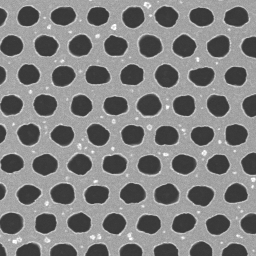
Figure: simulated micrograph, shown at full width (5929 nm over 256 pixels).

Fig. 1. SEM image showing a regular array of holes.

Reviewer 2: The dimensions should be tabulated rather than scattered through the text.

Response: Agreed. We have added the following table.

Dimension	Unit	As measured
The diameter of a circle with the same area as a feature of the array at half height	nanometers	498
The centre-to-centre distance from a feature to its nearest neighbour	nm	778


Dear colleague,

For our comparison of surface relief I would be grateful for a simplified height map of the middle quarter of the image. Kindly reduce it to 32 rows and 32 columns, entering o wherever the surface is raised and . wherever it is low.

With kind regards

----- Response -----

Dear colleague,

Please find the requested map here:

.oooooo.oooooooo..oooooo...ooooo
..oooo.....oooo.....ooo.....oooo
...oo......ooo......ooo......oo.
...oo......ooo......ooo......oo.
..oooo.....ooo.....oooo.....oooo
ooooooooooooooooooooooooo..ooooo
oooooooooooooooooooooooooooooooo
ooooooooooooooooooooo.oooooooooo
oo....ooooo....oooo.....oooo....
oo.....ooo......ooo.....ooo.....
oo.....ooo......oo.......oo.....
oo.....ooo......ooo.....oooo....
oo....ooooo...oooooo...ooooo....
oooooooooooooooooooooooooooooooo
oooooooooooooooooooooooooooooooo
ooooooo..ooooooo...oooooo..ooooo
..oooo.....oooo.....ooo.....oooo
...ooo.....ooo......ooo......ooo
..oooo.....oooo.....ooo......ooo
..ooooo....oooo....oooo.....oooo
oooooooo.ooooooooooooooooooooooo
oooooooooooooooooooooooooooooooo
ooooooooooooooooooooooooooooo.oo
oo....oooo.....oooo....oooo.....
o......ooo......ooo.....ooo.....
o......ooo......oo......ooo.....
o.....oooo.....oooo.....oooo....
ooo..ooooooo.oooooooo..ooooooo.o
oooooooooooooooooooooooooooooooo
oooooooooooooooooooooooooooooooo
..ooooo..oooooo....ooooo...ooooo
..oooo.....ooo......ooo.....oooo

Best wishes